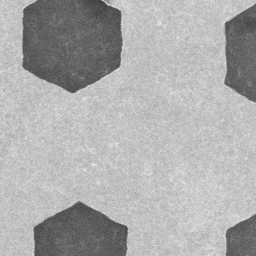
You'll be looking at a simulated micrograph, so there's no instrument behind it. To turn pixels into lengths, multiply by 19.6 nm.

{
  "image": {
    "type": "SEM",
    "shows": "holes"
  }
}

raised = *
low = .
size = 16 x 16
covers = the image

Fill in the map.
**.....*********
*.......******..
*.......******..
*.......******..
**.....*******..
****.*********..
****************
****************
****************
****************
****************
****************
****************
***....*********
**......******..
**......******..